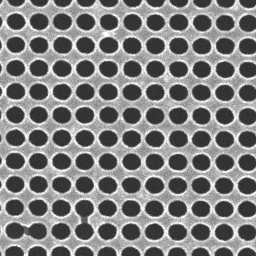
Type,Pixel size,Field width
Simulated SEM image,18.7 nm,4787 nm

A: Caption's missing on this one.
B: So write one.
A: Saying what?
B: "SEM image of a regular array of holes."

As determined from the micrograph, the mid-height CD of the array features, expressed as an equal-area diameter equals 345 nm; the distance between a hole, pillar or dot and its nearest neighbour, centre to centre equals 431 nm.